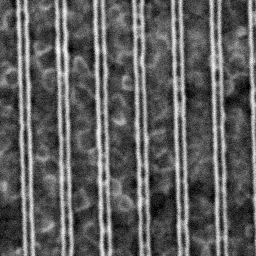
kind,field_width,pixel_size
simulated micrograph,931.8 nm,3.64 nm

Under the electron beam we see parallel lines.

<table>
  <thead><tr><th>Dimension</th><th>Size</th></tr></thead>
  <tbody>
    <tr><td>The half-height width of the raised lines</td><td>8.98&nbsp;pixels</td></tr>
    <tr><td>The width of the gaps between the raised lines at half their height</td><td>107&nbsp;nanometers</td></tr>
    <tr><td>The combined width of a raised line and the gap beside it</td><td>140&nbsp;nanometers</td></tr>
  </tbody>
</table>